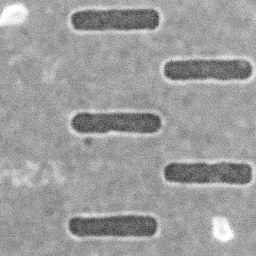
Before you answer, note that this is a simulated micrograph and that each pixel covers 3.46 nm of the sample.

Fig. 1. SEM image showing holes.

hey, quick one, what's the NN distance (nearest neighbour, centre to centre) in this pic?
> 357 nm